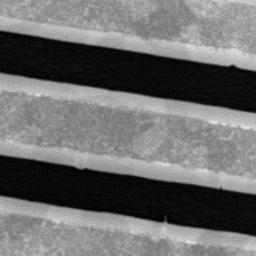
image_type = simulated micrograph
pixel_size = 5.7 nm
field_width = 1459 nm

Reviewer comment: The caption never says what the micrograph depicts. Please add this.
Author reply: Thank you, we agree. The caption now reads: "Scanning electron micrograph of one or a few lines or trenches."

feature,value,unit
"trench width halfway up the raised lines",0.318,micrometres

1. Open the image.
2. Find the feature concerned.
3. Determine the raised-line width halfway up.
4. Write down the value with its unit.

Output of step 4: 377 nm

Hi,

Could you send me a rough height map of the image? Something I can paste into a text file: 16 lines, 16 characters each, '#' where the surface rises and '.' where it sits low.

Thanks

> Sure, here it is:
################
################
.......#########
.............###
................
###.............
#########.......
################
################
..##############
........########
...............#
................
#####...........
###########.....
################